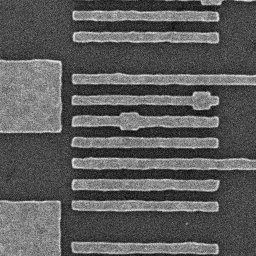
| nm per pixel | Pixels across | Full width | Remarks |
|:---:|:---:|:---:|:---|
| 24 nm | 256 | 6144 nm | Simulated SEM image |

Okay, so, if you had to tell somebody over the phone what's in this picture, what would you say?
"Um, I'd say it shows wiring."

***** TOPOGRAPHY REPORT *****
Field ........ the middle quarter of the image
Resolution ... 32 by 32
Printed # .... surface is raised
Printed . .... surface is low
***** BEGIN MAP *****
................................
................................
.............##.................
..##############################
..##############################
................................
................................
................................
..##############################
..##############################
................................
................................
..............#####.............
..##############################
..##############################
..............########..########
................................
................................
...##......#######..............
..##############################
..##############################
................................
................................
......##........................
..##############################
..##############################
................................
................................
................................
..##############################
..##############################
.........##........###..........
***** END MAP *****